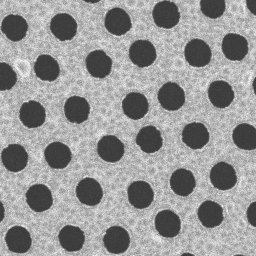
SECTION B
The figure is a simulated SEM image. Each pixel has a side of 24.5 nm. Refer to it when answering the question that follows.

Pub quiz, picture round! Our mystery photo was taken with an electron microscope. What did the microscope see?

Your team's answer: a regular array of holes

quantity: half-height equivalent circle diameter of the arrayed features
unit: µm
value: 0.679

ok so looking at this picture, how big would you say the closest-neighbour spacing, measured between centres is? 1060 nanometres